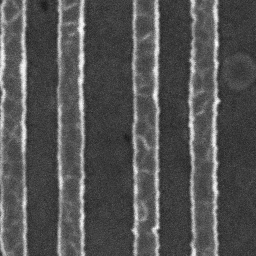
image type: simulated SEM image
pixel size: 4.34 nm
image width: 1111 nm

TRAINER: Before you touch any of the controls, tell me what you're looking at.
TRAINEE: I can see one or a few lines or trenches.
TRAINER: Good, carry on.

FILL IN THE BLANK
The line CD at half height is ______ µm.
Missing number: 0.107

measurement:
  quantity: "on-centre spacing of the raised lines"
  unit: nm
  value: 284